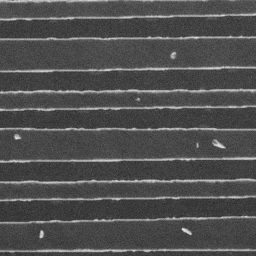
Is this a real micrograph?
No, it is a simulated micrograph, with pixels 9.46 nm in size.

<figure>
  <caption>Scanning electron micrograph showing lines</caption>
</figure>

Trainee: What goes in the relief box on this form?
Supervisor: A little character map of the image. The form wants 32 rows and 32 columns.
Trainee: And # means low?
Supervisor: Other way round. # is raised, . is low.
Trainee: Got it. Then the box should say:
################################
################################
................................
................................
................................
################################
################################
################################
###########################.....
................................
................................
....############################
################################
#######################.........
................................
................................
################################
################################
################################
################################
................................
................................
.............................###
################################
################################
................................
................................
..................##############
################################
################################
################################
................................